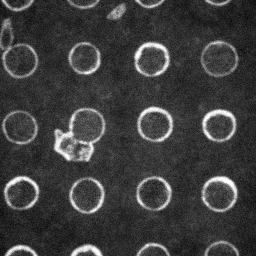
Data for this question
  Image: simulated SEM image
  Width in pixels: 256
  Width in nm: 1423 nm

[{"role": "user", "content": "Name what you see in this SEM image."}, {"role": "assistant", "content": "a regular array of raised bodies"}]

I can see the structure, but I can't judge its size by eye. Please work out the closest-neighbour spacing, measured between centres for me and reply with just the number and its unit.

0.363 microns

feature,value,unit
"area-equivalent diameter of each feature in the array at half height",183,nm